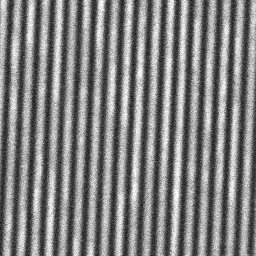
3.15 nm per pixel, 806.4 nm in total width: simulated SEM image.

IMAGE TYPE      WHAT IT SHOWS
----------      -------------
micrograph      parallel lines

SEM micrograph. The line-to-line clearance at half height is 21.6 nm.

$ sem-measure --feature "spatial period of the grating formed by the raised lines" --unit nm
43.9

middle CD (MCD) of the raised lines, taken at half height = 21.3 nm